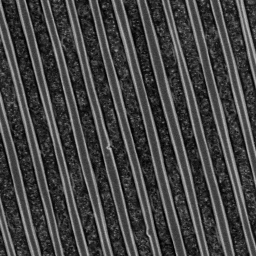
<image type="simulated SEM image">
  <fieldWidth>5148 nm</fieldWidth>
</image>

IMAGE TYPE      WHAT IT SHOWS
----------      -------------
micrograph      parallel lines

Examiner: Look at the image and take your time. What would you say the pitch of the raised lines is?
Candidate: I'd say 23.4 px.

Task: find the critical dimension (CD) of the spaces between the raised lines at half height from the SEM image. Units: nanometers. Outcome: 310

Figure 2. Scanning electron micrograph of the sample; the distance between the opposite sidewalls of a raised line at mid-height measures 0.163 micrometres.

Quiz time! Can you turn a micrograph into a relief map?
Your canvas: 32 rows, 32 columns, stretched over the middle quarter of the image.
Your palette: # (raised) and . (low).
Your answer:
.....#....##.....##...###....#..
#....#.....##....##...###....##.
#....##....##....##....##....##.
#....##....##....##....##.....#.
#....##....###....##...###....##
##....#....###....##...###....##
##....##....##....##....##....##
##....##....##....##....##.....#
##....##....##.....##...###....#
.##....##....##....##...###....#
.##....##....##....##....##....#
.##....##....##....###...###...#
.###...##....##.....##...###....
..##....##....##....##...###....
..##....##....##....##....##....
..##....##....##....###...###...
..###...##....###...###...###...
..###....##....##....##....##...
...##....##....##....##....##...
...##....##....##....###...###..
...###...##....###...###...###..
...###....##....##....##....##..
....##....##....##....##....##..
....##....##....##....##....###.
....###...###....##...###...###.
....###...###....##...###....##.
#....##....##....##....##....##.
#....##....###...##....##....###
#....###...###....##...###....##
#....###...###....##....##....##
##....##....##....##....##....##
##....##....##....##....##....##